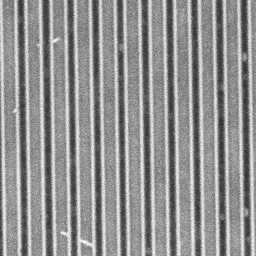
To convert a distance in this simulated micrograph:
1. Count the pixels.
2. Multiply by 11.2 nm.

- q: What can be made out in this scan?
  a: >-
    parallel lines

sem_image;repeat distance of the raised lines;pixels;24.8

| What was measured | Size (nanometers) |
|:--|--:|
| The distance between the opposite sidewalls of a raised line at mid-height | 121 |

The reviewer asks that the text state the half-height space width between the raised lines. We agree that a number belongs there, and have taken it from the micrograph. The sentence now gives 0.155 micrometres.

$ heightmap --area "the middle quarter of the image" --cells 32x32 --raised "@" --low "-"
-@@----@@----@@----@@@---@@@----
-@@----@@----@@----@@@---@@@----
-@@----@@----@@----@@@---@@@----
-@@----@@----@@----@@@---@@@----
-@@----@@----@@----@@@---@@@----
-@@----@@----@@@---@@@---@@@----
-@@----@@----@@@---@@@---@@@----
-@@----@@----@@@---@@@---@@@----
-@@----@@----@@@---@@@---@@@----
-@@----@@----@@@---@@@---@@@----
-@@----@@----@@@---@@@---@@@----
-@@----@@----@@@---@@@---@@@----
-@@----@@----@@@---@@@---@@@----
-@@----@@----@@@---@@@----@@----
-@@----@@----@@@---@@@----@@----
-@@----@@----@@@---@@@----@@----
-@@----@@@---@@@---@@@----@@----
-@@----@@@---@@@---@@@----@@----
-@@----@@@---@@@---@@@----@@----
-@@----@@@---@@@---@@@----@@----
-@@----@@@---@@@---@@@----@@----
-@@----@@@---@@@---@@@----@@----
-@@----@@@---@@@---@@@----@@----
-@@----@@@---@@@---@@@----@@----
-@@----@@@---@@@----@@----@@----
-@@----@@@---@@@----@@----@@----
-@@----@@@---@@@----@@----@@----
-@@----@@@---@@@----@@----@@----
-@@@---@@@---@@@----@@----@@----
-@@@---@@@---@@@----@@----@@----
-@@@---@@@---@@@----@@----@@----
-@@@---@@@---@@@----@@----@@----